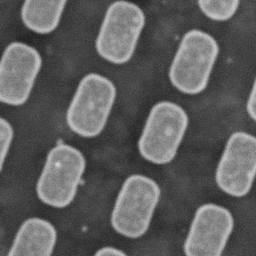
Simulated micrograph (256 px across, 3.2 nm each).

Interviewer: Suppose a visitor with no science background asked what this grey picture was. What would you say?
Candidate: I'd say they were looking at raised bodies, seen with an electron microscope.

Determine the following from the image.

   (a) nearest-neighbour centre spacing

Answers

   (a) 0.246 um